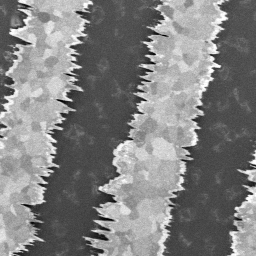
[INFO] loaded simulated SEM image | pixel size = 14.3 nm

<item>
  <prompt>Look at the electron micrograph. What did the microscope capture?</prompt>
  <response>one or a few lines or trenches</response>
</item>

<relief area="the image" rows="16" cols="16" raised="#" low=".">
..###.....####..
..###.....####..
.####....####...
.####.....###...
.####....####...
.###.....####...
.###.....###....
####....####....
###.....####....
###....#####....
###....####.....
###....####.....
##.....####.....
##....#####....#
##.....###.....#
#.....####.....#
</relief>